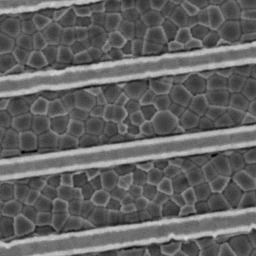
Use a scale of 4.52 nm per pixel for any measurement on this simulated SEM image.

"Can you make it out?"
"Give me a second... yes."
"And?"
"one or a few lines or trenches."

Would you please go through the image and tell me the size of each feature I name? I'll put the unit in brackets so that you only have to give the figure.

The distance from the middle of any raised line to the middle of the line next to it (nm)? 372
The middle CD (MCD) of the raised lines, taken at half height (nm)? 71.1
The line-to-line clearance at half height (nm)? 297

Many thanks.